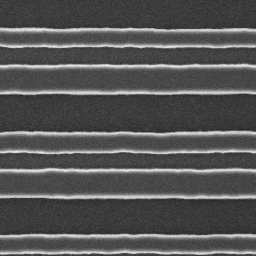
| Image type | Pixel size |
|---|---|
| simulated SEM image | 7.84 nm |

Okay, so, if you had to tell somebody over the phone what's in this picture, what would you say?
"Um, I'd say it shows lines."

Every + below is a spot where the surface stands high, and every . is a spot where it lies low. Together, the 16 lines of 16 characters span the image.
................
................
++++++++++++++++
++++++++++++++++
++++++++++++++++
++++++++++++++++
................
................
++++++++++++++++
++++++++++++++++
++++++++++++++++
++++++++++++++++
................
................
................
++++++++++++++++